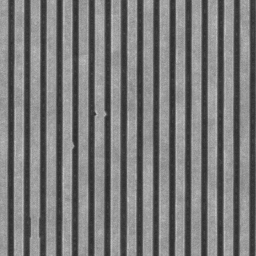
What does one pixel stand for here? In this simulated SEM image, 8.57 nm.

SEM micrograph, parallel lines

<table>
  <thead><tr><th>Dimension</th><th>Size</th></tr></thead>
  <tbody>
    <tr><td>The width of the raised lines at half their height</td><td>0.0857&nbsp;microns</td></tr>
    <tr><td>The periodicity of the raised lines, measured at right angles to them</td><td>138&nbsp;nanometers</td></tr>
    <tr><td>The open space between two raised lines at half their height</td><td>54.6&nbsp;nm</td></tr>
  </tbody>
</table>